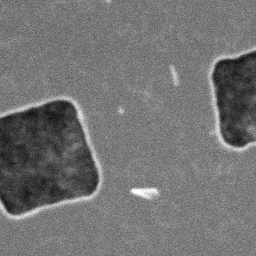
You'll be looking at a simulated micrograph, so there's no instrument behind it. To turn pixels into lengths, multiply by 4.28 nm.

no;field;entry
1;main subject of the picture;holes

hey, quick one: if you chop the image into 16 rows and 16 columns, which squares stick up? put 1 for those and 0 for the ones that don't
1111111111111111
1111111111111111
1111111111111111
1111111111111110
1111111111111000
1111111111111000
1110011111111000
0000011111111100
0000011111111100
0000001111111111
0000001111111111
0000001111111111
0000011111111111
1111111111111111
1111111111111111
1111111111111111